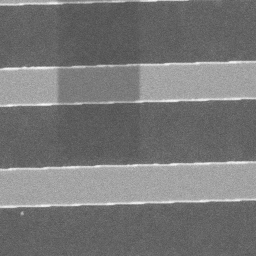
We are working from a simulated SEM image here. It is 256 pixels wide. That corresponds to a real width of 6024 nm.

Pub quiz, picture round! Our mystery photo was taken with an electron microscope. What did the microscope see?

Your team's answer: lines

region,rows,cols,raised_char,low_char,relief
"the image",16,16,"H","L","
LLLLLLLLLLLLLLLL
LLLLLLLLLLLLLLLL
LLLLLLLLLLLLLLLL
LLLLLLLLLLLLLLLL
HHHHHHHHHHHHHHHH
HHHHHHHHHHHHHHHH
HHHHLLLLLLLLLLLL
LLLLLLLLLLLLLLLL
LLLLLLLLLLLLLLLL
LLLLLLLLLLLLLLLL
LLHHHHHHHHHHHHHH
HHHHHHHHHHHHHHHH
HHHHHHHHHHHHHHHL
LLLLLLLLLLLLLLLL
LLLLLLLLLLLLLLLL
LLLLLLLLLLLLLLLL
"